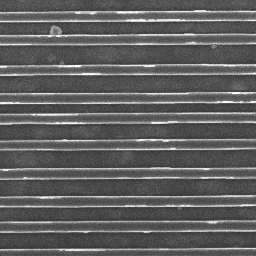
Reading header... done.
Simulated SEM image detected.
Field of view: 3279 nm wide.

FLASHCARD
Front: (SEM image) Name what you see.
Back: parallel lines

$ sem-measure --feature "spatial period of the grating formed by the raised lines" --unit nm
336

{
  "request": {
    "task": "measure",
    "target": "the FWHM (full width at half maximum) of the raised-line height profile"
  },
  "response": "136 nm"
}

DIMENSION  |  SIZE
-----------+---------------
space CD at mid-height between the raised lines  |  218 nm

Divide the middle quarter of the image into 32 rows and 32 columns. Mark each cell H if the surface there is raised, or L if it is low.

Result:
HHHHHHHHHHHHHHHHHHHHHHHHHHHHHHHH
HHHHHHHHHHHHHHHHHHHHHHHHHHHHHHHH
HHHHHHHHHHHHHHHHHHHHHHHHHHHHHHHH
LLLLLLLLLLLLLLLLLLLLLLLLLLLLLLLL
LLLLLLLLLLLLLLLLLLLLLLLLLLLLLLLL
LLLLLLLLLLLLLLLLLLLLLLLLLLLLLLLL
LLLLLLLLLLLLLLLLLLLLLLLLLLLLLLLL
HHHHHHHHHHHHHHHHHHHLLHHHHHHHHHHH
HHHHHHHHHHHHHHHHHHHHHHHHHHHHHHHH
HHHHHHHHHHHHHHHHHHHHHHHHHHHHHHHH
LLLLLLLLLLLLLLLLLLLLLLLLLLLLLLLL
LLLLLLLLLLLLLLLLLLLLLLLLLLLLLLLL
LLHHHHHHHHHHHHHHHHHHHHHHHHHHHHHH
HHHHHHHHHHHHHHHHHHHHHHHHHHHHHHHH
HHHHHHHHHHHHHHHHHHHHHHHHHHHHHHHH
LLLLLLLLLLLLLLLLLLLLLLLLLLLLLLLL
LLLLLLLLLLLLLLLLLLLLLLLLLLLLLLLL
LLLLLLLLLLLLLLLLLLLLLLLLLLLLLLLL
LLLLLLLLLLLLLLLLLLLLLLLLLLLLLLLL
HHHHHHHHHHHHHHHHHHHHHHHHHHHHHHHH
HHHHHHHHHHHHHHHHHHHHHHHHHHHHHHHH
LLLLLLLLLLLLLLLLLLLLLLLLLLLLLLLL
LLLLLLLLLLLLLLLLLLLLLLLLLLLLLLLL
LLLLLLLLLLLLLLLLLLLLLLLLLLLLLLLL
LLLLLLLLLLLLLLLLLLLLLLLLLLLLLLLL
LLLLLLLLLLLLLLLLLLLLLLLLLLLLLLLL
HHHHHHHHHHHHHHHHHHHHHHHHHHHHHHHH
HHHHHHHHHHHHHHHHHHHHHHHHHHHHHHHH
HHHHHHHHHHLLLLLLLLLLLLLLLLLLLLLL
LLLLLLLLLLLLLLLLLLLLLLLLLLLLLLLL
LLLLLLLLLLLLLLLLLLLLLLLLLLLLLLLL
LLLLLLLLLLLLLLLLLLLLLLLLLLLLLLLL